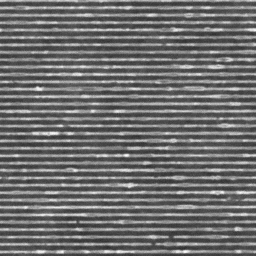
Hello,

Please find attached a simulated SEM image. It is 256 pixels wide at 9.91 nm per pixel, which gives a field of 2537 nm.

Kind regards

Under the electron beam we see parallel lines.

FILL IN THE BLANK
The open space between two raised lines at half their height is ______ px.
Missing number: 5.25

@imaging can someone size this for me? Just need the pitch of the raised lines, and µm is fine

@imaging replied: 0.0733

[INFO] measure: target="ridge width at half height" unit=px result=1.75